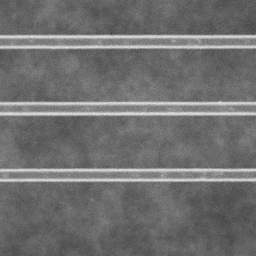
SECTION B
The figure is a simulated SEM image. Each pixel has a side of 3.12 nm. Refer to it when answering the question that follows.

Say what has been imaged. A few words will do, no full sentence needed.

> one or a few lines or trenches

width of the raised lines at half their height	34.3	nanometres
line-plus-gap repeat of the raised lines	208	nm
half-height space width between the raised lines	0.173	micrometres